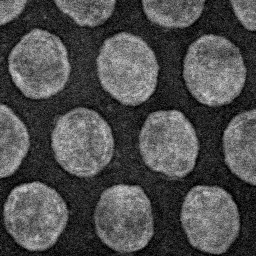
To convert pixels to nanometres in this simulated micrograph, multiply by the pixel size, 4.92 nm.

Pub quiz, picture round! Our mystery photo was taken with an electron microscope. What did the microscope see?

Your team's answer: a regular array of raised bodies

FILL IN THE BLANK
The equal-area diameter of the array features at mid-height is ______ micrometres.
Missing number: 0.308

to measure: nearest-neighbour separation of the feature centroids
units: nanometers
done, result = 420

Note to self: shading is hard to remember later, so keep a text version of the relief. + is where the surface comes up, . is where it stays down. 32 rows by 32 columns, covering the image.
+++....+++++++....+++++++....+++
++......++++++....+++++++....+++
+........++++......+++++......++
...............................+
...++++........+................
..++++++.....+++++......+++++...
..++++++.....++++++.....++++++..
.+++++++....+++++++....+++++++..
.++++++++...++++++++...+++++++..
.+++++++.....++++++....++++++++.
..++++++.....++++++....+++++++..
...++++.......+++++.....++++++..
...............+++.......++++...
+...............................
++......++++.......++++.......++
+++....++++++.....++++++.....+++
+++....+++++++....++++++....++++
+++....+++++++....+++++++...++++
+++....+++++++....+++++++...++++
+++....+++++++....+++++++...++++
++......+++++......+++++.....+++
++.......+++........++++.....+++
...............................+
..++++........+++.......+++.....
.++++++......+++++.....++++++...
.+++++++....+++++++....++++++...
.+++++++....+++++++....+++++++..
.+++++++....+++++++....+++++++..
.+++++++....+++++++....+++++++..
..+++++.....+++++++.....+++++...
...+++.......+++++......+++++...
................................